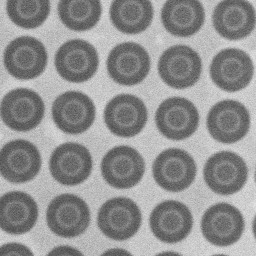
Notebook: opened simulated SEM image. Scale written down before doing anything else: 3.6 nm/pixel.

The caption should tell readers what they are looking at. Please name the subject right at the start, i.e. an array of small figures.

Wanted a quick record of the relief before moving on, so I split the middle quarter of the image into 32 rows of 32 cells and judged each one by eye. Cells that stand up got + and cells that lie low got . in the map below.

.+++++...+...++++++...+...++++++
..+++...+++...++++....+...++++++
........+++....++....++....++++.
.......+++++........++++........
+....++++++++......++++++......+
++++++++++++++....++++++++......
++++++++++++++++++++++++++++++++
......++++++++...+++++++++++++++
.......+++++.......+++++++.....+
.+++....+++.........++++........
+++++...++....+++...++++........
+++++...++...+++++...++...++++..
+++++...++...+++++...++...+++++.
+++++...++...+++++...++..++++++.
.+++...+++...+++++...++...+++++.
.......+++....++....+++...++++..
......+++++.........+++.........
+...++++++++.......+++++........
++++++++++++++..+++++++++......+
...+++++++++++++++++++++++++++++
.....++++++++....+++++++++++++++
......+++++.......+++++++.....++
.++....+++.........++++........+
++++...+++...+++..+.+++.........
++++...++...+++++.++++....+++...
++++...++...+++++.++++...+++++..
++++...++...+++++...++...+++++..
+++....++....++++...++...+++++..
......++++..........++....+++...
.....+++++.........++++.........
...+++++++++......+++++.........
++++++++++++++.++++++++++.....++